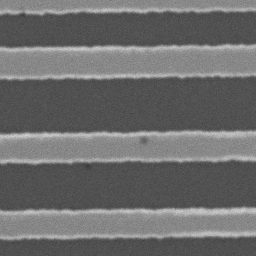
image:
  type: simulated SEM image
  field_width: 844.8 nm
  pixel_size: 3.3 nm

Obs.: lines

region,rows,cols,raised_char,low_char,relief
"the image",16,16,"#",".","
################
................
................
################
################
................
................
................
################
################
................
................
................
################
################
................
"